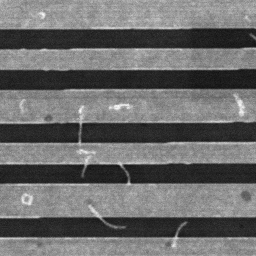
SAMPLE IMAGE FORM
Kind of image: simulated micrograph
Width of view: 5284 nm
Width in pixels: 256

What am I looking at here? lines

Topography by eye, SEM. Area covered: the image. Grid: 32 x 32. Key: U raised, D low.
UUUUUUUUUUUUUUUUUUUUUUUUUUUUUUUU
UUUUUUUUUUUUUUUUUUUUUUUUUUUUUUUU
UUUUUUUUUUUUUUUUUUUUUUUUUUUUUUUU
UUUUUUUUUUUUUUUUUUUUUUUUDDDDDDDD
DDDDDDDDDDDDDDDDDDDDDDDDDDDDDDDD
DDDDDDDDDDDDDDDDDDDDDDDDDDDDDDDD
UUUUUUUUUUUUUUUUUUUUUUUUUUUUUUUU
UUUUUUUUUUUUUUUUUUUUUUUUUUUUUUUU
UUUUUUUUUUUUUUUUUUUUUUUUUUUUUUUU
DDDDDDDDDDDDDDDDDDDDDDDDDDDDDDDD
DDDDDDDDDDDDDDDDDDDDDDDDDDDDDDDD
UUUUUUUUUUUUUUUUUUUUUUUUUUUUUUUU
UUUUUUUUUUUUUUUUUUUUUUUUUUUUUUUU
UUUUUUUUUUUUUUUUUUUUUUUUUUUUUUUU
UUUUUUUUUUUUUUUUUUUUUUUUUUUUUUUU
DDDDDDDDDDDDDDDDDDDDDDDDDDDDDDDD
DDDDDDDDDDDDDDDDDDDDDDDDDDDDDDDD
DDDDDDDDDDDDDDDDDDDDDDDDDDDDDDDD
UUUUUUUUUUUUUUUUUUUUUUUUUUUUUUUU
UUUUUUUUUUUUUUUUUUUUUUUUUUUUUUUU
DDDDDDDDDDUDDDUUDDDDDDDDDDDDDDDD
DDDDDDDDDDDDDDDDDDDDDDDDDDDDDDDD
DDDDDDDDDDDDDDDDDDDDDDDDDDDDDDDD
UUUUUUUUUUUUUUUUUUUUUUUUUUUUUUUU
UUUUUUUUUUUUUUUUUUUUUUUUUUUUUUUU
UUUUUUUUUUUUUUUUUUUUUUUUUUUUUUUU
UUUUUUUUUUUUUUUUUUUUUUUUUUUUUUUU
DDDDDDDDDDDDDDDDDDDDDDDDDDDDDDDD
DDDDDDDDDDDDDDDDDDDDDDDDDDDDDDDD
DDDDDDDDDDDDDDDDDDDDDDDDDDDDDDDD
UUUUUUUUUUUUUUUUUUUUUUUUUUUUUUUU
UUUUUUUUUUUUUUUUUUUUUUUUUUUUUUUU